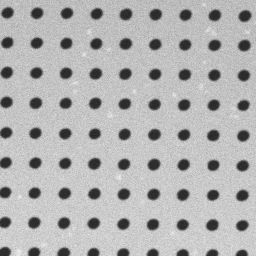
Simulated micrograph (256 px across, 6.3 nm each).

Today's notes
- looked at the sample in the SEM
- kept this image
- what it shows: a regular array of holes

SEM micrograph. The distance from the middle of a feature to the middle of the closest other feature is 186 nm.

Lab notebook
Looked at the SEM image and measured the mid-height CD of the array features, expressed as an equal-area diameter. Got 0.0729 um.